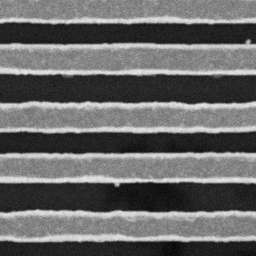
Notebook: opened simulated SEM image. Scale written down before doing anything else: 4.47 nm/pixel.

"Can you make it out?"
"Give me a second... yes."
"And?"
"lines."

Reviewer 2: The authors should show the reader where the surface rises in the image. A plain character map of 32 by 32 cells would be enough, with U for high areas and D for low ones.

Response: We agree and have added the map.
UUUUUUUUUUUUUUUUUUUUUUUUUUUUUUUU
UUUUUUUUUUUUUUUUUUUUUUUUUUUUUUUU
UUUUUUUUUUUUUUUUUUUUUUUUUUUUUUUU
DDDDDDDDDDDDDDDDDDDDDDDDDDDDDDDD
DDDDDDDDDDDDDDDDDDDDDDDDDDDDDDDD
DDDDDDDDDDDDDDDDDDDDDDDDDDDDDDDD
UUUUUUUUUUUUUUUUUUUUUUUUUUUUUUUU
UUUUUUUUUUUUUUUUUUUUUUUUUUUUUUUU
UUUUUUUUUUUUUUUUUUUUUUUUUUUUUUUU
DDDDDDDDDDDDDDDDDDDDDDDDDDDDDDDD
DDDDDDDDDDDDDDDDDDDDDDDDDDDDDDDD
DDDDDDDDDDDDDDDDDDDDDDDDDDDDDDDD
DDDDDDDDDDDDDDDDDDDDDDDDDDDDDDDD
UUUUUUUUUUUUUUUUUUUUUUUUUUUUUUUU
UUUUUUUUUUUUUUUUUUUUUUUUUUUUUUUU
UUUUUUUUUUUUUUUUUUUUUUUUUUUUUUUU
DDDDDDDDDDDDDDDDDDDDDDDDDDDDDDDD
DDDDDDDDDDDDDDDDDDDDDDDDDDDDDDDD
DDDDDDDDDDDDDDDDDDDDDDDDDDDDDDDD
UUUUUUUUUUUUUUUUUUUUUUUUUUUUUUUU
UUUUUUUUUUUUUUUUUUUUUUUUUUUUUUUU
UUUUUUUUUUUUUUUUUUUUUUUUUUUUUUUU
UUUUUUUUUUUUUUUUUUUUUUUUUUUUUUUU
DDDDDDDDDDDDDDDDDDDDDDDDDDDDDDDD
DDDDDDDDDDDDDDDDDDDDDDDDDDDDDDDD
DDDDDDDDDDDDDDDDDDDDDDDDDDDDDDDD
DDDUUUUUUUUDDDUUDDDDDDDDDDDDUUDD
UUUUUUUUUUUUUUUUUUUUUUUUUUUUUUUU
UUUUUUUUUUUUUUUUUUUUUUUUUUUUUUUU
UUUUUUUUUUUUUUUUUUUUUUUUUUUUUUUU
DDDDDDDDDDDDDDDDDDDDDDDDDDDDDDDD
DDDDDDDDDDDDDDDDDDDDDDDDDDDDDDDD